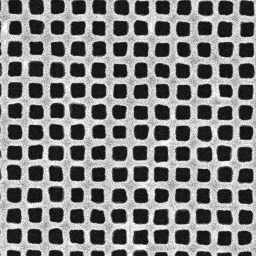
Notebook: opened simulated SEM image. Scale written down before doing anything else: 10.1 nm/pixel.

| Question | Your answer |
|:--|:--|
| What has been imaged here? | a regular array of holes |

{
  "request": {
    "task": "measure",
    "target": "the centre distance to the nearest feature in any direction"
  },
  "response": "204 nm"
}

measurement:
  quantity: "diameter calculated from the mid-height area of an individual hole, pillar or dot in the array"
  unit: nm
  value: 158